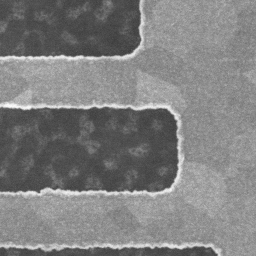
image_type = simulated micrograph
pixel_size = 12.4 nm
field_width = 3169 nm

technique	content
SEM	one or a few lines or trenches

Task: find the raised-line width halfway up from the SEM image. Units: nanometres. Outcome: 655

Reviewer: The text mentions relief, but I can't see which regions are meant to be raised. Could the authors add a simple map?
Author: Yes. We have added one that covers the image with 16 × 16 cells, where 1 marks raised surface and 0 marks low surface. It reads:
0000000001111111
0000000001111111
0000000001111111
0000000011111111
1111111111111111
1111111111111111
1111111111111111
0000000000011111
0000000000011111
0000000000011111
0000000000011111
0000000000011111
1111111111111111
1111111111111111
1111111111111111
0010000000000111